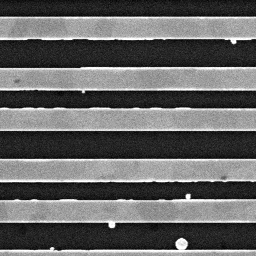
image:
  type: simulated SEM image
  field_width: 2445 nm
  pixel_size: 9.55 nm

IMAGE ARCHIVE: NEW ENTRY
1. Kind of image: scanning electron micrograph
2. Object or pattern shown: lines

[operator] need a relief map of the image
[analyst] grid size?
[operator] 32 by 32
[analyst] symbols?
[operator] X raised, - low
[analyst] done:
--------------------------------
--------------------------------
XXXXXXXXXXXXXXXXXXXXXXXXXXXXXXXX
XXXXXXXXXXXXXXXXXXXXXXXXXXXXXXXX
XXXXXXXXXXXXXXXXXXXXXXXXXXXXXXXX
--------------------------------
--------------------------------
--------------------------------
----------XXX----XXXXXXXXXXXXXXX
XXXXXXXXXXXXXXXXXXXXXXXXXXXXXXXX
XXXXXXXXXXXXXXXXXXXXXXXXXXXXXXXX
--------------------------------
--------------------------------
--------------------------------
XXXXXXXXXXXXXXXXXXXXXXXXXXXXXXXX
XXXXXXXXXXXXXXXXXXXXXXXXXXXXXXXX
--------------------------------
--------------------------------
--------------------------------
--------------------------------
XXXXXXXXXXXXXXXXXXXXXXXXXXXXXXXX
XXXXXXXXXXXXXXXXXXXXXXXXXXXXXXXX
XXXXXXXXXXXXXXXXXXXXXXXXXXXXXXXX
--------------------------------
--------------------------------
XXXXXXXXXXXXXXXXXXXXXXXXXXXXXXXX
XXXXXXXXXXXXXXXXXXXXXXXXXXXXXXXX
XXXXXXXXXXXXXXXXXXXXXXXXXXXXXXXX
--------------------------------
--------------------------------
----------------------X---------
XXXXXXXXXXXXXXXXXXXXXXXXXXXXXXXX